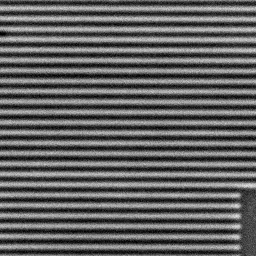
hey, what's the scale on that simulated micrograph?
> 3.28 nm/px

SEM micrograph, parallel lines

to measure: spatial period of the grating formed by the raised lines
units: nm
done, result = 34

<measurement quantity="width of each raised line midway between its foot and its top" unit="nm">11.5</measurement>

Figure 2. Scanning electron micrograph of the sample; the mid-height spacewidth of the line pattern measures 0.0226 microns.